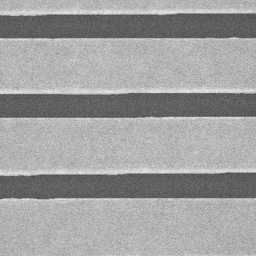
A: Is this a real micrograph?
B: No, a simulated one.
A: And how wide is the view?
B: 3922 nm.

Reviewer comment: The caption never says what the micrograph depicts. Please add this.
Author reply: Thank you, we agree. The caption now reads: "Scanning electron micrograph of lines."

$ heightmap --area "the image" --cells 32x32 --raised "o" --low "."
oooooooooooooooooooooooooooooooo
oooooooooooooooooooooooooooooooo
................................
................................
................................
oooooooooooooooooooooooooooooooo
oooooooooooooooooooooooooooooooo
oooooooooooooooooooooooooooooooo
oooooooooooooooooooooooooooooooo
oooooooooooooooooooooooooooooooo
oooooooooooooooooooooooooooooooo
ooooooooooooooooooooooooooo.....
................................
................................
................................
oooooooooooooooooooooooooooooooo
oooooooooooooooooooooooooooooooo
oooooooooooooooooooooooooooooooo
oooooooooooooooooooooooooooooooo
oooooooooooooooooooooooooooooooo
oooooooooooooooooooooooooooooooo
ooooooooooooooooooooooooo.......
................................
................................
................................
oooooooooooooooooooooooooooooooo
oooooooooooooooooooooooooooooooo
oooooooooooooooooooooooooooooooo
oooooooooooooooooooooooooooooooo
oooooooooooooooooooooooooooooooo
oooooooooooooooooooooooooooooooo
oooooooooooooooooooooooooooooooo